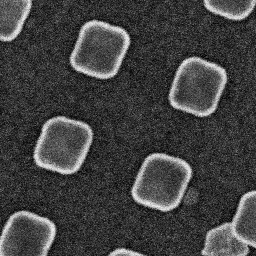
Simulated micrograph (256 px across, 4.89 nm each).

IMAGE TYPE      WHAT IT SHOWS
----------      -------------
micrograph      raised bodies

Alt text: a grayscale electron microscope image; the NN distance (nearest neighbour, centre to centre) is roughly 0.498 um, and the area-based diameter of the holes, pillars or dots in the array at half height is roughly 261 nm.